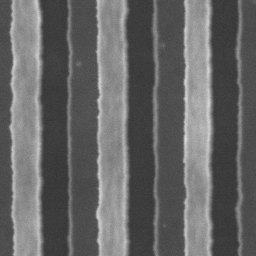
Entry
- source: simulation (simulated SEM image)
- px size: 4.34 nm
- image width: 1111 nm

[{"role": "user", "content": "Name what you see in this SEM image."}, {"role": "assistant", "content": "lines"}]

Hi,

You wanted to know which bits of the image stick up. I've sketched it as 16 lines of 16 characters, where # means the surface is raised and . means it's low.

##..####..###..#
##..####..###..#
##..####..###..#
##..####..###..#
##..####..###..#
##..####..###..#
##..####..###..#
##..####..###..#
##..####..###..#
##..####..###..#
##..####..###..#
##..####..###..#
##..####..###..#
##..####..###..#
##..####..###..#
###.####..###..#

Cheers